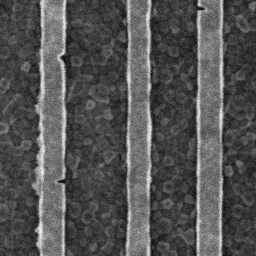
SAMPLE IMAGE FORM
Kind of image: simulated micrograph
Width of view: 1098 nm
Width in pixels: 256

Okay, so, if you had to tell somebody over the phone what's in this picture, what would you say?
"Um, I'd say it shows one or a few lines or trenches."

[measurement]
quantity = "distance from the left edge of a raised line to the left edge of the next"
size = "337 nm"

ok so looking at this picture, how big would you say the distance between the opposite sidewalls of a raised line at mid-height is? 95 nm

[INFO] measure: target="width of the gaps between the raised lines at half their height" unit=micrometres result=0.245